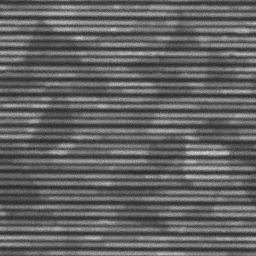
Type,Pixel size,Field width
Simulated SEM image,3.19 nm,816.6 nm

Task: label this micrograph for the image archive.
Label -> parallel lines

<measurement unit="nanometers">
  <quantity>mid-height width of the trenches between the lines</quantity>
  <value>15.2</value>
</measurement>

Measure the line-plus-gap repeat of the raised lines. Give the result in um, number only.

0.0245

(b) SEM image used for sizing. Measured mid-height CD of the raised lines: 10 nm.